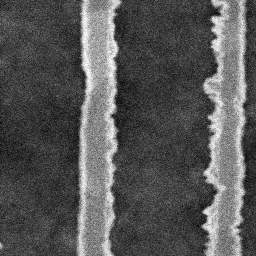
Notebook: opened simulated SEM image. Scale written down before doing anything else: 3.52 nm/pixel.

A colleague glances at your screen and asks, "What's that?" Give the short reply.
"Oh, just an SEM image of one or a few lines or trenches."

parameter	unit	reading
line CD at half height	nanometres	92.8